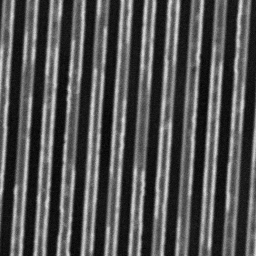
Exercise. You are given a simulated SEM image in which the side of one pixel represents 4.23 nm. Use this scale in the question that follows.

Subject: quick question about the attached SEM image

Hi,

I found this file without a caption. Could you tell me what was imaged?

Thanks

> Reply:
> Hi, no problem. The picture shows parallel lines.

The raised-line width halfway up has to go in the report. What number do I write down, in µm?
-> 0.047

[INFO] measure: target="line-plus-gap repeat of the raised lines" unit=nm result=99.5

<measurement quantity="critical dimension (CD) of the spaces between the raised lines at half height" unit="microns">0.0539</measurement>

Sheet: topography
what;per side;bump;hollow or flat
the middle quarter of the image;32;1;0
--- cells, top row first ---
00110000110000110001110001110001
00110001110001110001110001110001
01110001110001110001110001100001
01110001110001110001110001100001
01110001110001110001110001100001
01110001110001110001110001100001
01110001110001100001100001100001
01110001110001100001100001100001
01110001110001100001100001100001
01110001100001100001100001100001
01110001100001100001100001100001
01100001100001100001100001100011
01100001100001100011100011100011
01100001100011100011100011100011
01100001100011100011100011100011
01100001100011100011100011100011
01100001100011100011100011100011
11100011100011100011100011100011
11100011100011100011100011100011
11100011100011100011100011100011
11100011100011100011100011100011
11100011100011100011000011000011
11100011100011000011000011000011
11100011100011000011000011000011
11100011100011000011000011000011
11100011100011000011000011000011
11100011000011000011000011000011
11100011000011000011000111000111
11100011000011000111000111000111
11000011000011000111000111000111
11000011000011000111000111000111
11000011000011000111000111000111